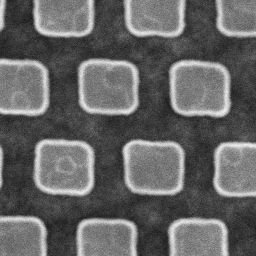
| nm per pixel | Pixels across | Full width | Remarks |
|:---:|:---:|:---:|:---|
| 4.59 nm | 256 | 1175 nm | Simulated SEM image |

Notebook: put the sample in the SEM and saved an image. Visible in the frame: raised bodies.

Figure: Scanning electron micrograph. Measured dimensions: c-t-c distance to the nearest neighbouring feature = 0.414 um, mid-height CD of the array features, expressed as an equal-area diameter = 0.275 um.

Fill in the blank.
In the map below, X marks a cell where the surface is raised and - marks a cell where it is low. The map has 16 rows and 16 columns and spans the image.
--XXXX--XXX---XX
--XXXX--XXX---XX
----------------
----------------
XXX--XXX---XXX--
XXX--XXXX--XXX--
XXX--XXX---XXX--
----------------
----------------
--XXXX--XXX---XX
--XXXX--XXX--XXX
--XXXX--XXX--XXX
----------------
----------------
XXX--XXX---XXX--
XXX--XXX---XXX--